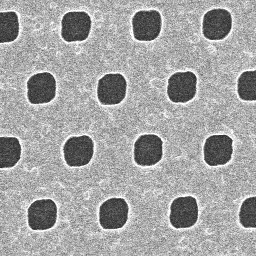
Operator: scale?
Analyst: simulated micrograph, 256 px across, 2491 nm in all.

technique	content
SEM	a regular array of holes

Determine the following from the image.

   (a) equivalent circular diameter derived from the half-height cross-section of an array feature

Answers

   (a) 307 nm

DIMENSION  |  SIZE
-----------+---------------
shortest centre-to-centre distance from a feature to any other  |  70.2 pixels